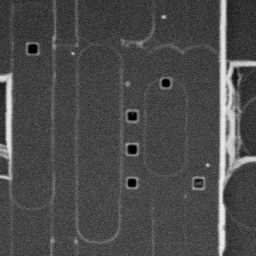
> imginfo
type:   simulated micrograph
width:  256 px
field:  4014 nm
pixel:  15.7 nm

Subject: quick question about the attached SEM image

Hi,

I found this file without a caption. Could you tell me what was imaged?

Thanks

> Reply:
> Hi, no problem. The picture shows wiring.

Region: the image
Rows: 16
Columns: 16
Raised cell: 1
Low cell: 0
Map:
1111111111111100
1111111111111100
1111111111111100
1111111111111100
1111111111111100
0111111111111100
0111111111111100
0111111111111100
0111111111111100
1111111111111100
1111111111111100
1111111111111100
1111111111111100
1111111111111100
1111111111111100
1111111111111100